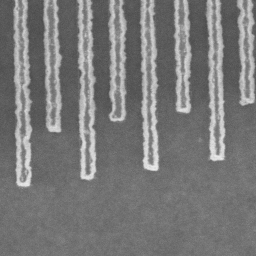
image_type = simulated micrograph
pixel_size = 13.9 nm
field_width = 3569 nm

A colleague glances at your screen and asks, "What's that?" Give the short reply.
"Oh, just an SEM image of parallel lines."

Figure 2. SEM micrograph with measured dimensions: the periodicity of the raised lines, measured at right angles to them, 0.449 micrometres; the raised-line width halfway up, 148 nm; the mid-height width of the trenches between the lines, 294 nanometres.